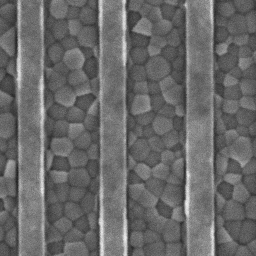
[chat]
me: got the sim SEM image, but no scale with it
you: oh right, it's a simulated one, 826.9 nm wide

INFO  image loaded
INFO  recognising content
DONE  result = one or a few lines or trenches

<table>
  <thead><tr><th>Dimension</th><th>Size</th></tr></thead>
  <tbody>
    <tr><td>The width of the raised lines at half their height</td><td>81.9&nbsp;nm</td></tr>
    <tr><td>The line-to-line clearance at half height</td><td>186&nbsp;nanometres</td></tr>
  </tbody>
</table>